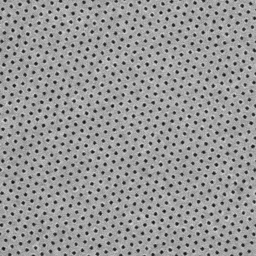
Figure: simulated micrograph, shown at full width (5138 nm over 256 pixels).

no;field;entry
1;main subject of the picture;a regular array of holes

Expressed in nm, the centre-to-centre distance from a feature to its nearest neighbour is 174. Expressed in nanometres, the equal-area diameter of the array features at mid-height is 84.8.